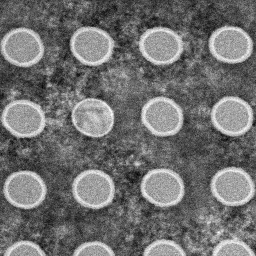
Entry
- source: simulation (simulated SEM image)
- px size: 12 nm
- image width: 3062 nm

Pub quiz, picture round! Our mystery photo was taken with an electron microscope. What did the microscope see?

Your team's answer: a regular array of raised bodies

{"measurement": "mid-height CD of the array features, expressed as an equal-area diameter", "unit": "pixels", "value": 37.8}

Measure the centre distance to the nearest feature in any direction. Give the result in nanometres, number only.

833